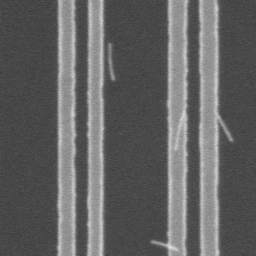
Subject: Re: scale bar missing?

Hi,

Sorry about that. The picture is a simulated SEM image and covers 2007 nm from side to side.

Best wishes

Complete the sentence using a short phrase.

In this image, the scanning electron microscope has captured lines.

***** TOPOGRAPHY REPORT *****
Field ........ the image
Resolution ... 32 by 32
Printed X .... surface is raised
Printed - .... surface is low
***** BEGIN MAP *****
-------XX--XX--------XX--XX-----
-------XX--XX--------XX--XX-----
-------XX--XX--------XX--XX-----
-------XX--XX--------XX--XX-----
-------XX--XX--------XX--XX-----
-------XX--XX--------XX--XX-----
-------XX--XX--------XX--XX-----
-------XX--XX--------XX--XX-----
-------XX--XX--------XX--XX-----
-------XX--XX--------XX--XX-----
-------XX--XX--------XX--XX-----
-------XX--XX--------XX--XX-----
-------XX--XX--------XX--XX-----
-------XX--XX--------XX--XX-----
-------XX--XX--------XX--XX-----
-------XX--XX--------XX--XX-----
-------XX--XX--------XX--XX-----
-------XX--XX--------XX--XX-----
-------XX--XX--------XX--XX-----
-------XX--XX--------XX--XX-----
-------XX--XX--------XX--XX-----
-------XX--XX--------XX--XX-----
-------XX--XX--------XX--XX-----
-------XX--XX--------XX--XX-----
-------XX--XX--------XX--XX-----
-------XX--XX--------XX--XX-----
-------XX--XX--------XX--XX-----
-------XX--XX--------XX--XX-----
-------XX--XX--------XX--XX-----
-------XX--XX--------XX--XX-----
-------XX--XX--------XX--XX-----
-------XX--XX--------XX--XX-----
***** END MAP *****